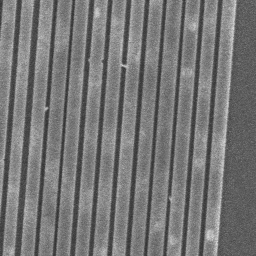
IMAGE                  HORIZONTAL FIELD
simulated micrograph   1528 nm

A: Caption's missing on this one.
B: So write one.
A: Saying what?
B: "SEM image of parallel lines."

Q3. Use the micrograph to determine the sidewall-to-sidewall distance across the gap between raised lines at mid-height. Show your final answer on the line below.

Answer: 0.0313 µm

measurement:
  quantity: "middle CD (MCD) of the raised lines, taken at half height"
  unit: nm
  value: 78.1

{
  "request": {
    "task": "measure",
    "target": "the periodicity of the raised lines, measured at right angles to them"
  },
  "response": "0.109 micrometres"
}